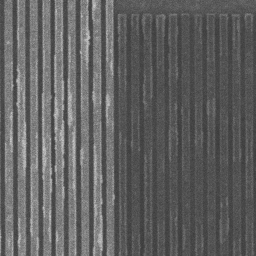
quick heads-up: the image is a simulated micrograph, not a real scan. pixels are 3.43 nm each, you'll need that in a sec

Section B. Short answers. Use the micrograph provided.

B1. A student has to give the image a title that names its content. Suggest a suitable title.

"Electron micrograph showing parallel lines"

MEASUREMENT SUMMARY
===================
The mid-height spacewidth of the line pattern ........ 19.3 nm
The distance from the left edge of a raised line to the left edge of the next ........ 43.3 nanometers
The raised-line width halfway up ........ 26.1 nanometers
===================